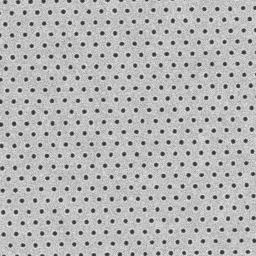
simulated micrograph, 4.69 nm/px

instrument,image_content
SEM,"a regular array of holes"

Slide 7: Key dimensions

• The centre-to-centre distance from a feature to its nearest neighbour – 58.3 nanometres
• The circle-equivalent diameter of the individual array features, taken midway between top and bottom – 21.8 nanometres